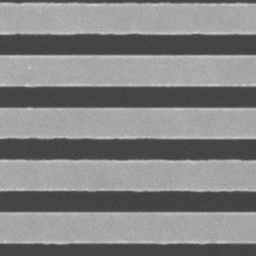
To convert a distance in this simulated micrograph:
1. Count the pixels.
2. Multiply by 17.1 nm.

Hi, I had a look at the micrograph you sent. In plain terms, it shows lines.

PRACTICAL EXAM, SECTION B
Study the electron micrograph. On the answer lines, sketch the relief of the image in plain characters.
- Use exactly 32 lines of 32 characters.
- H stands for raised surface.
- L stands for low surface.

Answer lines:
HHHHHHHLHHHLLLLHHLLLHHLLLLLLLHLL
HHHHHHHHHHHHHHHHHHHHHHHHHHHHHHHH
HHHHHHHHHHHHHHHHHHHHHHHHHHHHHHHH
HHHHHHHHHHHHHHHHHHHHHHHHHHHHHHHH
LLLLLLLLLLLLLLLLLLLLLLLLLLLLLLLL
LLLLLLLLLLLLLLLLLLLLLLLLLLLLLLLL
LLLLLLLLLLLLLLLLLLLLLLLLLLLLLLLL
HHHHHHHHHHHHHHHHHHHHHHHHHHHHHHHH
HHHHHHHHHHHHHHHHHHHHHHHHHHHHHHHH
HHHHHHHHHHHHHHHHHHHHHHHHHHHHHHHH
HHHHHHHHHHHHHHHHHHHHHHHHHHHHHHHH
LLLLLLLLLLLLLLLLLLLLLLLLLLLLLLLL
LLLLLLLLLLLLLLLLLLLLLLLLLLLLLLLL
LLLHLLLLLLLLLLLLLLLLLLLLLLLLLLLL
HHHHHHHHHHHHHHHHHHHHHHHHHHHHHHHH
HHHHHHHHHHHHHHHHHHHHHHHHHHHHHHHH
HHHHHHHHHHHHHHHHHHHHHHHHHHHHHHHH
LLLLLLLLLLLLLLLLLLLLLLLLLLLLLLLL
LLLLLLLLLLLLLLLLLLLLLLLLLLLLLLLL
LLLLLLLLLLLLLLLLLLLLLLLLLLLLLLLL
HHHHHHHHHHHHHHHHHHHHHHHHHHHHHHHH
HHHHHHHHHHHHHHHHHHHHHHHHHHHHHHHH
HHHHHHHHHHHHHHHHHHHHHHHHHHHHHHHH
HHHHHHHHHHHHHHHHHHHHHHHHHHHHHHHH
LLLLLLLLLLLLLLLLLLLLLLLLLLLLLLLL
LLLLLLLLLLLLLLLLLLLLLLLLLLLLLLLL
LLLLLLLLLLLLLLLLLLLLLLLLLLLLLLLL
HHHHHHHHHHHHHHHHHHHHHHHHHHHHHHHH
HHHHHHHHHHHHHHHHHHHHHHHHHHHHHHHH
HHHHHHHHHHHHHHHHHHHHHHHHHHHHHHHH
LLLLLLLLLLLLLLLLLLLLLLLLLLLLLLLL
LLLLLLLLLLLLLLLLLLLLLLLLLLLLLLLL